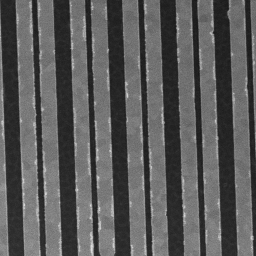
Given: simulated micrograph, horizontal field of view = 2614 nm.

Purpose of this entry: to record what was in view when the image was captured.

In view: parallel lines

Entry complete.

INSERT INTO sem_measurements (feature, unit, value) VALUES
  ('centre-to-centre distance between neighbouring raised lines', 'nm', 272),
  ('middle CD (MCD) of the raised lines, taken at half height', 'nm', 158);